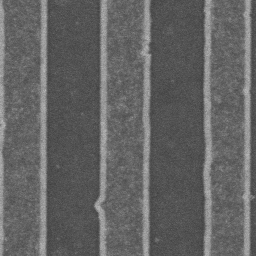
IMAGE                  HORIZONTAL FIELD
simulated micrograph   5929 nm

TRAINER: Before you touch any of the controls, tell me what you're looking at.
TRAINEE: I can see one or a few lines or trenches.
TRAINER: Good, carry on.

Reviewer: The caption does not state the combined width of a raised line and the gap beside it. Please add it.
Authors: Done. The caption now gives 2380 nanometres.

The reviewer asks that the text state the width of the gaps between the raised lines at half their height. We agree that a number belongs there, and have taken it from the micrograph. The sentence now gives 1410 nm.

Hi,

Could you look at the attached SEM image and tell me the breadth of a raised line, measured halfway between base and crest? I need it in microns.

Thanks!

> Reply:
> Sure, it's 0.976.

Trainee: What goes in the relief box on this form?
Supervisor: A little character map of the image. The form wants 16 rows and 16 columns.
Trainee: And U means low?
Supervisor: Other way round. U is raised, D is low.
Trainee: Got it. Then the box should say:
UUUDDDUUUDDDDUUD
UUUDDDUUUDDDDUUD
UUUDDDUUUDDDDUUD
UUUDDDUUUDDDDUUD
UUUDDDUUUDDDDUUD
UUUDDDDUUDDDDUUD
UUUDDDUUUDDDDUUD
UUUDDDDUUDDDDUUD
UUUDDDDUUDDDDUUD
UUUDDDDUUDDDDUUD
UUUDDDUUUDDDDUUD
UUUDDDUUUDDDDUUD
UUUDDDUUUDDDDUUD
UUUDDDUUUDDDDUUD
UUUDDDUUUDDDDUUD
UUUDDDUUUDDDDUUD